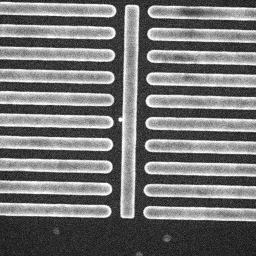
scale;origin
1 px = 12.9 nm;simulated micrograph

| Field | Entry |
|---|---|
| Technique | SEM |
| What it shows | groups of lines, slits or small figures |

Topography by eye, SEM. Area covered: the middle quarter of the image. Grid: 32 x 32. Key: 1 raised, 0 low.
00000000000000011100000000000000
00000000000000011100000000000000
11111111111100011100011111111110
11111111111100011100011111111111
11111111111100011100011111111111
00000000000000011100000000000000
00000000000000011100000000000000
11111110000000011100000000000000
11111111111100011100011111111111
11111111111100011100011111111111
00000000000000011100011111111111
00000000000000011100000000000000
00000000000000011100000000000000
11111111111100011100000000000000
11111111111100011100011111111111
11111111111100011100011111111111
00000000000000011100000000000000
00000000000000011100000000000000
00000000000000011100000000000000
11111111111100011100011111111111
11111111111100011100011111111111
00000011111000011100011111111111
00000000000000011100000000000000
00000000000000011100000000000000
11111111111000011100000000000000
11111111111100011100111111111111
11111111111100011100111111111111
00000000000000011100000011111111
00000000000000111100000000000000
00000000000000111100000000000000
11111111111100111100011111111111
11111111111100111000111111111111